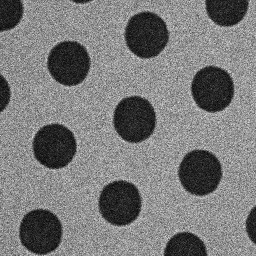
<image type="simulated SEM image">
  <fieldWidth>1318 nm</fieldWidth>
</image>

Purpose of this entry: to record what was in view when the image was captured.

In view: a regular array of holes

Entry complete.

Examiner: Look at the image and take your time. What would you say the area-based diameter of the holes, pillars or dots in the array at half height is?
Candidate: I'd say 0.23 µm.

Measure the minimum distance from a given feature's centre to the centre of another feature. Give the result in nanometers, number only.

432